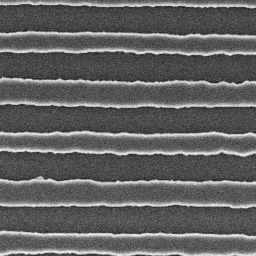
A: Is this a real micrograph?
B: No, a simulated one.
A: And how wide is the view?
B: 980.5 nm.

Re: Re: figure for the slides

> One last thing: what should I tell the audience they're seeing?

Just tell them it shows lines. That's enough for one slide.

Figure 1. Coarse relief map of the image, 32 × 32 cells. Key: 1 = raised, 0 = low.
11101111111111111111111111111111
00000000000000000000000000000000
00000000000000000000000000000000
00000000000000000000000000000000
11111111111111111111111111111110
11111111111111111111111111111111
00100000110000001111111111111111
00000000000000000000000000000000
00000000000000000000000000000000
00000000000000000000000000000000
11111111111111111111111111111111
11111111111111111111111111111111
11111111111111111111111111111111
00000000000000000000000000000000
00000000000000000000000000000000
00000000000000000000000000000000
00000000000000000000000000000000
11111111111111111111111111111111
11111111111111111111111111111111
00000000000000000000000000000000
00000000000000000000000000000000
00000000000000000000000000000000
00000000000000000000000000000000
11111111111111111111111111111111
11111111111111111111111111111111
11111111111111111111111111111111
00000000000000000000000000000000
00000000000000000000000000000000
00000000000000000000000000000000
11111111111111111111111111111110
11111111111111111111111111111111
11111111111111111111111111111111